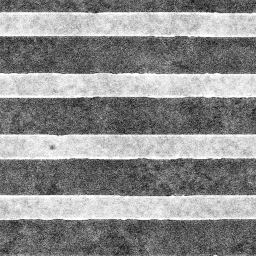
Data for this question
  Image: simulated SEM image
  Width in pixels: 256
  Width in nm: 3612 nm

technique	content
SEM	lines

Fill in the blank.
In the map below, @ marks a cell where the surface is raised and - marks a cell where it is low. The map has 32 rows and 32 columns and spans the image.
--------------------------------
--------------------------------
@@@@@@@@@@@@@@@@@@@@@@@@@@@@@@@@
@@@@@@@@@@@@@@@@@@@@@@@@@@@@@@@@
-------------------@@@-@@@@@@@@@
--------------------------------
--------------------------------
--------------------------------
--------------------------------
@@@@@@@@@@@@@@@@@@@@@@@@@@@@@@@@
@@@@@@@@@@@@@@@@@@@@@@@@@@@@@@@@
@@@@@@@@@@@@@@@@@@@@@@@@@@@@@@@@
--------------------------------
--------------------------------
--------------------------------
--------------------------------
--------------------------------
@@@@@@@@@@@@@@@@@@@@@@@@@@@@@@@@
@@@@@@@@@@@@@@@@@@@@@@@@@@@@@@@@
@@@@@@@@@@@@@@@@@@@@@@@@@@@@@@@@
--------------------------------
--------------------------------
--------------------------------
--------------------------------
--------------------------------
@@@@@@@@@@@@@@@@@@@@@@@@@@@@@@@@
@@@@@@@@@@@@@@@@@@@@@@@@@@@@@@@@
--------------------------------
--------------------------------
--------------------------------
--------------------------------
--------------------------------